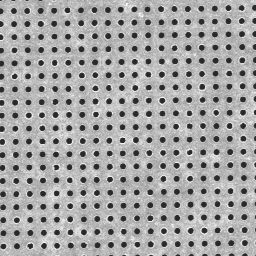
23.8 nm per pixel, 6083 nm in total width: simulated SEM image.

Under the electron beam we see a regular array of holes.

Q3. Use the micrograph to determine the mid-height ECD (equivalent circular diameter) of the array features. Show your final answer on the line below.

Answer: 137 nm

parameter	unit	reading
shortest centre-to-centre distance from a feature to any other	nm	307